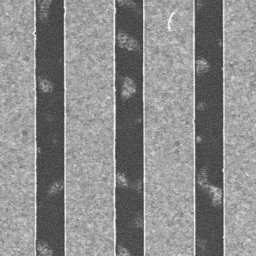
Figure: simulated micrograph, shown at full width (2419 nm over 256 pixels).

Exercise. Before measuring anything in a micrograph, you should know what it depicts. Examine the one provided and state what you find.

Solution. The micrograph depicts one or a few lines or trenches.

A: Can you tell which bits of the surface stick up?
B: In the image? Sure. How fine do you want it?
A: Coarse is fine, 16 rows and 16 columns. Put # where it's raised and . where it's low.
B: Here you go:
##..###..###..##
##..###..###..##
##..###..###..##
##..###..###..##
##..###..###..##
##..###..###..##
##..###..###..##
##..###..###..##
##..###..###..##
##..###..###..##
##..###..###..##
##..###..###..##
##..###..###..##
##..###..###..##
##..###..###..##
##..###..###..##